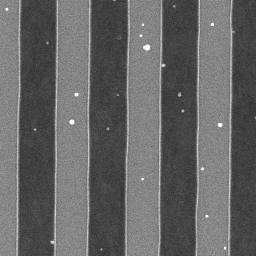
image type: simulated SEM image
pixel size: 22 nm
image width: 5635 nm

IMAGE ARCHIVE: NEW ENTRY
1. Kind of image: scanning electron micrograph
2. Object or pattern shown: groups of lines, slits or small figures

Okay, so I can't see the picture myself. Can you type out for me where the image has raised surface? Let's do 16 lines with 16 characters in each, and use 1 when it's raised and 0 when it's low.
0111001100110011
0111001100110011
0111001100110011
0111001100110011
0111001100110011
0111001100110011
0111001100110011
0111001100110011
0110001100110011
0111001100110011
0111001100110011
0110001100110011
0110001100110011
0110001100110011
0110011100110011
0110011100110011